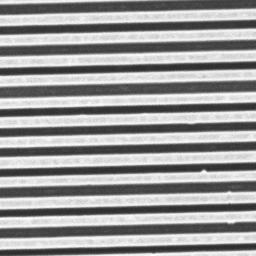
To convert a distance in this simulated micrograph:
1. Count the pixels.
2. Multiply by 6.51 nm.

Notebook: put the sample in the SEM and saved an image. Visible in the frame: parallel lines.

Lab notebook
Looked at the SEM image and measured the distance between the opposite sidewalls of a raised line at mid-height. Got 74 nanometers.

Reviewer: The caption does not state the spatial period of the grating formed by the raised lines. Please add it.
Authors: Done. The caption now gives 132 nm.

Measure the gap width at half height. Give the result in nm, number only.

55.3